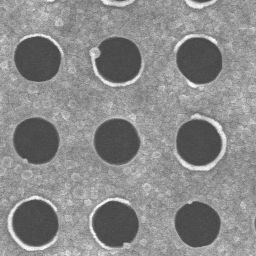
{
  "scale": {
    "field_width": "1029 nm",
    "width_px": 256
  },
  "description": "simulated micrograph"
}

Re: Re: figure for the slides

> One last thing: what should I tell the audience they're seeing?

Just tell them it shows a regular array of holes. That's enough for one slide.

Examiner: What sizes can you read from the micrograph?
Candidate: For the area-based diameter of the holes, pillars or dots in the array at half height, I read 185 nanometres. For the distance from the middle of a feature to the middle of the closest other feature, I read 325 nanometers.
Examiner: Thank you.